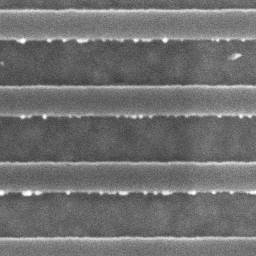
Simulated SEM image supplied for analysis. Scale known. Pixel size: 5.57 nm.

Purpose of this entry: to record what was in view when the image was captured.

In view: lines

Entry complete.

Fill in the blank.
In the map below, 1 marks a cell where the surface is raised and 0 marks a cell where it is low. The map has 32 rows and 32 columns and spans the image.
00000000000000000000000000000000
11111111111111111111111111111111
11111111111111111111111111111111
11111111111111111111111111111111
11111111111111111111111111111111
00000000000000000000000000000000
00000000000000000000000000000000
00000000000000000000000000000000
00000000000000000000000000000000
00000000000000000000000000000000
00000000000000000000000000000000
11111111111111111111111111111111
11111111111111111111111111111111
11111111111111111111111111111111
00110100000000001100000000000000
00000000000000000000000000000000
00000000000000000000000000000000
00000000000000000000000000000000
00000000000000000000000000000000
00000000000000000000000000000000
11111111111111111111111111111111
11111111111111111111111111111111
11111111111111111111111111111111
11111111111111111111111111111111
00000000000000000000000000000000
00000000000000000000000000000000
00000000000000000000000000000000
00000000000000000000000000000000
00000000000000000000000000000000
00000000000000000000000000000000
11111111111111111111111111111111
11111111111111111111111111111111